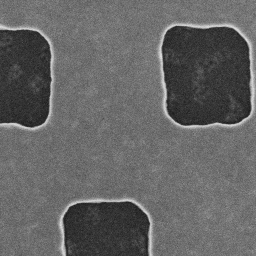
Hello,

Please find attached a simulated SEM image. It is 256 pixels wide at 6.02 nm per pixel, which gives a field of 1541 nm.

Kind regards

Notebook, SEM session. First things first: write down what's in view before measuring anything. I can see holes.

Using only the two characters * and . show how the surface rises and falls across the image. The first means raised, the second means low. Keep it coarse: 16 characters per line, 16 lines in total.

****************
****************
...*******.....*
...*******......
...*******......
...*******......
...*******......
...********....*
****************
****************
****************
****************
****************
****.....*******
****.....*******
****.....*******